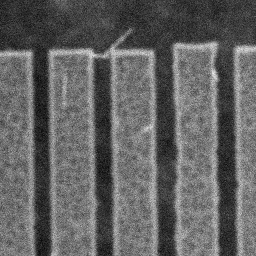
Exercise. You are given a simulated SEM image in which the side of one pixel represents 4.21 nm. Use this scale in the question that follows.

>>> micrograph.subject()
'one or a few lines or trenches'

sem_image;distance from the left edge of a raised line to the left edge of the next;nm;261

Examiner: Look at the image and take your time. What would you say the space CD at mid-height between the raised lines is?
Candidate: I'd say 93.2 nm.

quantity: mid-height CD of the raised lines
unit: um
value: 0.164